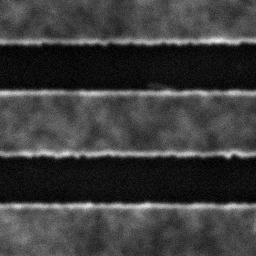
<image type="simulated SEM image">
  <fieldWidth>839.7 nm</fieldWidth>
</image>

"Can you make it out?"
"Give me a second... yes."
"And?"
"lines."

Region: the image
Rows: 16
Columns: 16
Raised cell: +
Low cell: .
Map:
++++++++++++++++
++++++++++++++++
++++++++++++++++
................
................
................
++++++++++++++++
++++++++++++++++
++++++++++++++++
++++++++++++++++
................
................
................
++++++++++++++++
++++++++++++++++
++++++++++++++++